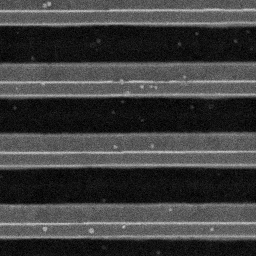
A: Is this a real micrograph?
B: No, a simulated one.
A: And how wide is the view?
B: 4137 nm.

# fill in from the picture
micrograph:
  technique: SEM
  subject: lines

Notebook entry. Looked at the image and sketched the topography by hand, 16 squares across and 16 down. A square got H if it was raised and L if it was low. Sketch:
HHHHHHHHHHHHHHHH
HHHHHHLLLLLLLLLL
LLLLLLLLLLLLLLLL
LLLLLLLLLLLLLLLL
HHHHHHHHHHHHHHHH
HHHHHHHHHHHHHHHH
LLLLLLLLLLLLLLLL
LLLLLLLLLLLLLLLL
HHHHHHHHHHHHHHHH
HHHHHHHHHHHHHHHH
LLLLLLLLLLLLLLLL
LLLLLLLLLLLLLLLL
LLLLLLLLLLLLLLLL
HHHHHHHHHHHHHHHH
HHHHHHHHHHHHHHHH
LLLLLLLLLLLLLLLL